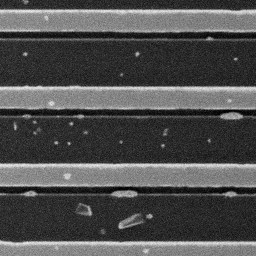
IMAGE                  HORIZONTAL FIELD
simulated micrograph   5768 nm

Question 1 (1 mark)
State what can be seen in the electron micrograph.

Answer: lines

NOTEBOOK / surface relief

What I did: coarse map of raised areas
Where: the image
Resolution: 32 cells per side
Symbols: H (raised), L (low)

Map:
LLLLLLLLLLLLLLLLLLLLLLLLLLLLLLLL
HHHHHHHHHHHHHHHHHHHHHHHHHHHHHHHH
HHHHHHHHHHHHHHHHHHHHHHHHHHHHHHHH
HHHHHHHHHHHHHHHHHHHHHHHHHHHHHHHH
LLLLLLLLLLLLLLLLLLLLLLLLLLLLLLLL
LLLLLLLLLLLLLLLLLLLLLLLLLLLLLLLL
LLLLLLLLLLLLLLLLLLLLLLLLLLLLLLLL
LLLLLLLLLLLLLLLLLLLLLLLLLLLLLLLL
LLLLLLLLLLLLLLLLLLLLLLLLLLLLLLLL
LLLLLLLLLLLLLLLLLLLLLLLLLLLLLLLL
LLLLLLLLLLLLLLLLLLLLLLLLLLLLLLLL
HHHHHHHHHHHHHHHHHHHHHHHHHHHHHHHH
HHHHHHHHHHHHHHHHHHHHHHHHHHHHHHHH
LLLHLLLHLLLHLLLHLLLHHHLLLLHHHHHH
LLLLLLLLLLLLLLLLLLLLLLLLLLLLLLLL
LLLLLLLLLLLLLLLLLLLLLLLLLLLLLLLL
LLLLLLLLLLLLLLLLLLLLLLLLLLLLLLLL
LLLLLLLLLLLLLLLLLLLLLLLLLLLLLLLL
LLLLLLLLLLLLLLLLLLLLLLLLLLLLLLLL
LLLLLLLLLLLLLLLLLLLLLLLLLLLLLLLL
LLLLLLLLLLLLLLLLLLLLLLLLLLLLLLLL
HHHHHHHHHHHHHHHHHHHHHHHHHHHHHHHH
HHHHHHHHHHHHHHHHHHHHHHHHHHHHHHHH
LLLLLLLLLLLLLLLLLLLLLLLLLLLLLLLL
LLLLLLLLLLLLLLLLLLLLLLLLLLLLLLLL
LLLLLLLLLLLLLLLLLLLLLLLLLLLLLLLL
LLLLLLLLLLLLLLLLLLLLLLLLLLLLLLLL
LLLLLLLLLLLLLLLLLLLLLLLLLLLLLLLL
LLLLLLLLLLLLLLLLLLLLLLLLLLLLLLLL
LLLLLLLLLLLLLLLLLLLLLLLLLLLLLLLL
HHHHHHHHHHHHHHHHHHHHHHHHHHHHHHHH
HHHHHHHHHHHHHHHHHHHHHHHHHHHHHHHH